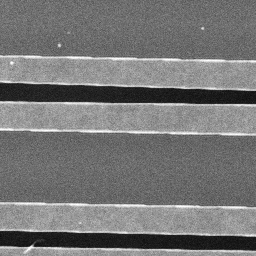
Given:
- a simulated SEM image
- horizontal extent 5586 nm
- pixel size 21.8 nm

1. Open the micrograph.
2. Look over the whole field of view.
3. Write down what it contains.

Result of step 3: lines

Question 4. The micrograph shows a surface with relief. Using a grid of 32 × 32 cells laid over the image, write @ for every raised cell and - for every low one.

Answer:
--------------------------------
--------------------------------
--------------------------------
--------------------------------
--------------------------------
--------------------------------
--------------------------------
@@@@@@@@@@@@@@@@@@@@@@----------
@@@@@@@@@@@@@@@@@@@@@@@@@@@@@@@@
@@@@@@@@@@@@@@@@@@@@@@@@@@@@@@@@
------@@@@@@@@@@@@@@@@@@@@@@@@@@
--------------------------------
--------------------------------
@@@@@@@@@@@@@@@@@@@@@@@@@@@@@@@@
@@@@@@@@@@@@@@@@@@@@@@@@@@@@@@@@
@@@@@@@@@@@@@@@@@@@@@@@@@@@@@@@@
----------------@@@@@@@@@@@@@@@@
--------------------------------
--------------------------------
--------------------------------
--------------------------------
--------------------------------
--------------------------------
--------------------------------
--------------------------------
@@@@@---------------------------
@@@@@@@@@@@@@@@@@@@@@@@@@@@@@@@@
@@@@@@@@@@@@@@@@@@@@@@@@@@@@@@@@
@@@@@@@@@@@@@@@@@@@@@@@@@@@@@@@@
------------------------------@@
--------------------------------
@@@@@@@@@@@@@@@@@@@@@@@@@@@@@@@@